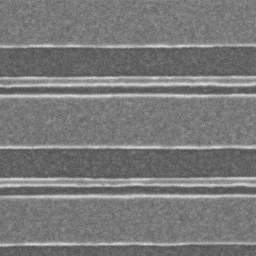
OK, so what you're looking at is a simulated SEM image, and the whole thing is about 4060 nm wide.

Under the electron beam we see lines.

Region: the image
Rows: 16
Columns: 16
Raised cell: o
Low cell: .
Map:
oooooooooooooooo
oooooooooooooooo
oooooooooooooooo
................
................
oooooooooooooooo
oooooooooooooooo
oooooooooooooooo
oooooooooooooooo
................
................
oooooooooooooooo
oooooooooooooooo
oooooooooooooooo
oooooooooooooooo
................